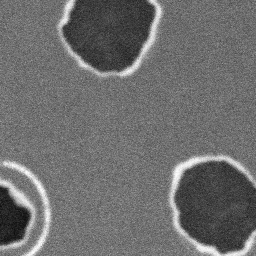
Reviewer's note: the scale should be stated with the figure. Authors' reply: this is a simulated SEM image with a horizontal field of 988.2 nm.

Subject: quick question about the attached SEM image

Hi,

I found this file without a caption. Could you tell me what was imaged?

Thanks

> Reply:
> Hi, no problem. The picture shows holes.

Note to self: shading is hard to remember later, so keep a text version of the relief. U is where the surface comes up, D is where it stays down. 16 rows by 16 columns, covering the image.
UUUUDDDDDDUUUUUU
UUUUDDDDDDUUUUUU
UUUUDDDDDUUUUUUU
UUUUUDDDDUUUUUUU
UUUUUUDDUUUUUUUU
UUUUUUUUUUUUUUUU
UUUUUUUUUUUUUUUU
UUUUUUUUUUUUUUUU
UUUUUUUUUUUUUUUU
UUUUUUUUUUUUUUUU
UUUUUUUUUUUUDDDU
UUUUUUUUUUUDDDDD
DUUUUUUUUUUDDDDD
DDUUUUUUUUUDDDDD
DDUUUUUUUUUUDDDD
UUUUUUUUUUUUUDDU